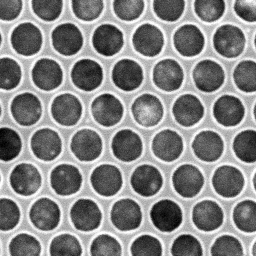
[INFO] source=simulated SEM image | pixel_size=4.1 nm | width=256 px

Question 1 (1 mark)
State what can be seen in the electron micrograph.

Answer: a regular array of holes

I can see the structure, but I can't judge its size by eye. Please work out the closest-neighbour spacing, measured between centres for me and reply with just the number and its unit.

165 nm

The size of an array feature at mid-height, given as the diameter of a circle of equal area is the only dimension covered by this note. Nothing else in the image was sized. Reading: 138 nm